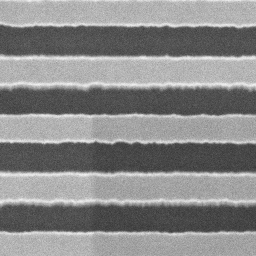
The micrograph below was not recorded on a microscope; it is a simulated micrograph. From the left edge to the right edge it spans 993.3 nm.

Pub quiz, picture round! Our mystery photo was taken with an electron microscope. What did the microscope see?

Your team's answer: lines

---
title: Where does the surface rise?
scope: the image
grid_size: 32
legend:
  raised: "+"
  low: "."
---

++++++++++++++++++++++++++++++++
++++++++++++++++++++++++++++++++
++++++++++++++++++++++++++++++++
................................
................................
................................
................................
++++++++++++++++++++++++++++++++
++++++++++++++++++++++++++++++++
++++++++++++++++++++++++++++++++
++++++++++++++++++++++++++++++++
................................
................................
................................
+++++++++++++++++++++++.++++++++
++++++++++++++++++++++++++++++++
++++++++++++++++++++++++++++++++
++++++++++++++++++++++++++++++++
................................
................................
................................
................................
++++++++++++++++++++++++++++++++
++++++++++++++++++++++++++++++++
++++++++++++++++++++++++++++++++
................................
................................
................................
................................
++++++++++++++++++++++++++++++++
++++++++++++++++++++++++++++++++
++++++++++++++++++++++++++++++++